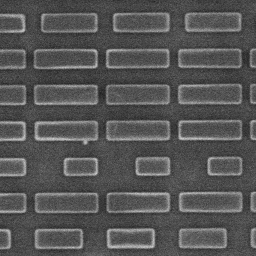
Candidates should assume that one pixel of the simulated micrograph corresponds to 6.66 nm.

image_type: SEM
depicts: wiring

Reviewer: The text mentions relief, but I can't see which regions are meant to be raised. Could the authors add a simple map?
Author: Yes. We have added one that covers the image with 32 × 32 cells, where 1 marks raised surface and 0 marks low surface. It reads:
00000000000000000000000000000000
00000000000000000000000000000000
11100111111100111111100111111100
11100111111100111111100111111100
00000000000000000000000000000000
00000000000000000000000000000000
11100111111100111111100111111101
11101111111101111111101111111101
11100110000000000000000000000000
00000000000000000000000000000000
00000000000000000000000000000000
11101111111101111111101111111101
11101111111101111111101111111101
00000000000000000000000000000000
00000000000000000000000000000000
11100111111101111111100111111101
11100111111101111111101111111101
00000000000000000000000000000000
00000000000000000000000000000000
00000000000000000000000000000000
11100000111100000111100000111100
11100000111100000111100000111100
00000000000000000000000000000000
00000000000000000000000000000000
11100111111101111111100111111101
11100111111101111111100111111101
00000000000000000000000000000000
00000000000000000000000000000000
00000000000000000000000000000000
10000111110001111110000111110001
10000111110000111110000111110000
00000000000000000000000000000000